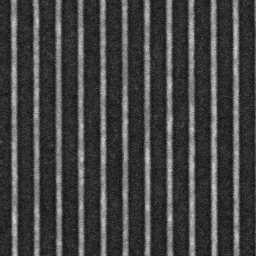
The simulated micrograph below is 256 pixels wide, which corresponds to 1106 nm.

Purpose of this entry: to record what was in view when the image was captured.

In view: parallel lines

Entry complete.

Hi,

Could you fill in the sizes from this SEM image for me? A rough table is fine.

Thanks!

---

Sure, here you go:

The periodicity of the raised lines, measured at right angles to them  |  95.7 nm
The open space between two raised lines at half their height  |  0.0755 micrometres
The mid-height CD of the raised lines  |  20 nm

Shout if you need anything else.